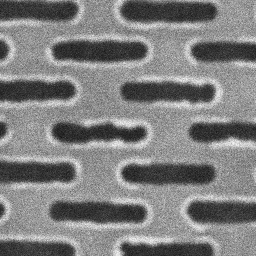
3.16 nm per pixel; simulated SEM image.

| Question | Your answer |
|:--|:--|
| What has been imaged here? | holes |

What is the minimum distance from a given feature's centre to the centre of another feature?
0.251 micrometres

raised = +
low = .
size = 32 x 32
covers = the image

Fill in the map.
..........+++++............+++++
..........+++++............+++++
.+++++...+++++++...........+++++
++++++++++++++++++++++++++++++++
++++++++++++++++++++++++++++++++
.++++++...........++++++........
.++++++............+++++........
+++++++...........++++++........
++++++++++++++++++++++++++++++++
++++++++++++++++++++++++++++++++
.........+++++++........++++++++
..........+++++............+++++
.......+++++++++...........+++++
++++++++++++++++++++++++++++++++
++++++++++++++++++++++++++++++++
.++++++..++++.++++++++++........
.+++++............++++++........
+++++++.......+...++++++....++..
++++++++++++++++++++++++++++++++
++++++++++++++++++++++++++++++++
.........+++++++.......++.++++++
.........++++++............+++++
.........++++++............+++++
++++++++++++++++++++++++++++++++
++++++++++++++++++++++++++++++++
+++++++.........++++++++........
.+++++............+++++.........
+++++++...........++++++........
++++++++++++++++++++++++++++++++
++++++++++++++++++++++++++++++++
.........++++++.+.++......++++++
.........++++++............+++++